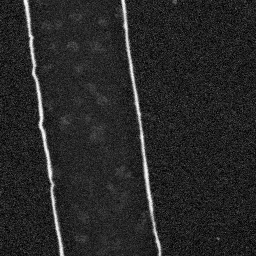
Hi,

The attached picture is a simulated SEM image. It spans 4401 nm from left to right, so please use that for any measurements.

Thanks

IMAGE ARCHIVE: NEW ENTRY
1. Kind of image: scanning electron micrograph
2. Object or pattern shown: one or a few lines or trenches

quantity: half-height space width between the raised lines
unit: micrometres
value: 1.65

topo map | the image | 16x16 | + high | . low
++......++++++++
++......++++++++
++......++++++++
++......++++++++
++......++++++++
++......++++++++
++.......+++++++
+++......+++++++
+++......+++++++
+++......+++++++
+++......+++++++
+++......+++++++
+++......+++++++
+++.......++++++
++++......++++++
++++......++++++